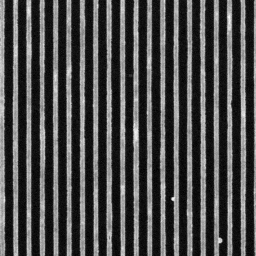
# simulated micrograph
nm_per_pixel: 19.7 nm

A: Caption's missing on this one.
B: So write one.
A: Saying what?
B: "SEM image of parallel lines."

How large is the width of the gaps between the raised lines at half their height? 185 nanometers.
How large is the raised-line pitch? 264 nanometers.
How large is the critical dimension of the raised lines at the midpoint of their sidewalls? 76.5 nm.